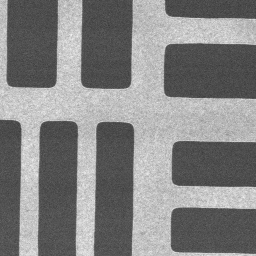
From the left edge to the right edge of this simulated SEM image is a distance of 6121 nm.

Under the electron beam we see groups of lines, slits or small figures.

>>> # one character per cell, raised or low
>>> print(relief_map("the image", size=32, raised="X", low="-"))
X------XXX-------XXXX-----------
X------XXX-------XXXX-----------
X------XXX-------XXXXXXXXXXXXXXX
X------XXX-------XXXXXXXXXXXXXXX
X------XXX-------XXXXXXXXXXXXXXX
X------XXX-------XXXX----------X
X------XXX-------XXXX-----------
X------XXX-------XXX------------
X------XXX-------XXX------------
X------XXX-------XXX------------
X------XXX------XXXX------------
XXXXXXXXXXXXXXXXXXXXX-----------
XXXXXXXXXXXXXXXXXXXXXXXXXXXXXXXX
XXXXXXXXXXXXXXXXXXXXXXXXXXXXXXXX
XXXXXXXXXXXXXXXXXXXXXXXXXXXXXXXX
---XX-----XX----XXXXXXXXXXXXXXXX
---XX-----XX-----XXXXXXXXXXXXXXX
---XX-----XX-----XXXXXXXXXXXXXXX
---XX-----XX-----XXXX-----------
---XX-----XX-----XXXX-----------
---XX-----XX-----XXXX-----------
---XX-----XX-----XXXX-----------
---XX-----XX-----XXXX-----------
---XX-----XX-----XXXXXXXXXXXXXXX
---XX-----XX-----XXXXXXXXXXXXXXX
---XX-----XX-----XXXXXXXXXXXXXXX
---XX-----XX-----XXXX-----------
---XX-----XX-----XXXX-----------
---XX-----XX-----XXXX-----------
---XX-----XX-----XXXX-----------
---XX-----XX-----XXXX-----------
---XX-----XX-----XXXXX----------